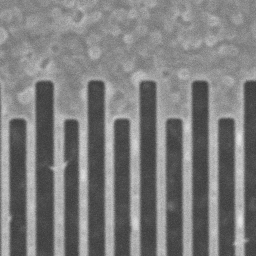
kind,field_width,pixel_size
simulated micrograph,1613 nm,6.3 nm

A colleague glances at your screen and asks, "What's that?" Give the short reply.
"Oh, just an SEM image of parallel lines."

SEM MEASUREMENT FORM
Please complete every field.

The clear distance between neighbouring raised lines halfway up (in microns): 0.115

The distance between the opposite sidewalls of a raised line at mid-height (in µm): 0.0489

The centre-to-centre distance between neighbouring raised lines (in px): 26.1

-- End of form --